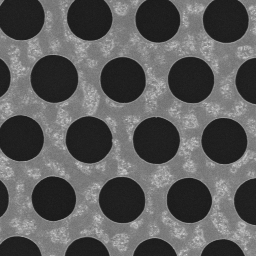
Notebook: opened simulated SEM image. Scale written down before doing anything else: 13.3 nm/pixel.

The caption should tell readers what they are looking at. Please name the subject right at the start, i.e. a regular array of holes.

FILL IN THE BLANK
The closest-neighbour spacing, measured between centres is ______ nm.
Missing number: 905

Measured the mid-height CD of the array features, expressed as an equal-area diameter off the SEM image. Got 0.616 µm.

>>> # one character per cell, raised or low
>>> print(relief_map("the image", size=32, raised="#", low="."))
.....####....#####....####....##
......##......###.....####.....#
......##......###......##......#
.....####.....###.....####.....#
#...######...#####....####....##
################################
################################
#####....#####...#####...######.
.###.....####.....###.....####..
.###......###.....###......###..
.###......###.....###......##...
.###.....####.....###.....####..
######..######...######..######.
################################
##.#############################
.....####....####.....####....##
.....###......###.....###......#
......##......###......##......#
.....###......###.....###......#
#....####....####.....####....##
###################.############
################################
#####...######...#####...######.
.###.....####.....###.....####..
.###.....###......###.....###...
.###.....###......###.....###...
.####....####.....###.....####..
######..######...#####...#####..
################################
################################
....#####....####....#####....##
.....###......###.....###.....##